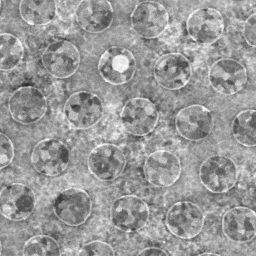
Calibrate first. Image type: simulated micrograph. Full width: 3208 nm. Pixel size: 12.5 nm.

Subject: a regular array of raised bodies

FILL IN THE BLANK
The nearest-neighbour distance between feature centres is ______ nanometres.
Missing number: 699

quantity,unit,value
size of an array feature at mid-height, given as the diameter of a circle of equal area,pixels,37.1